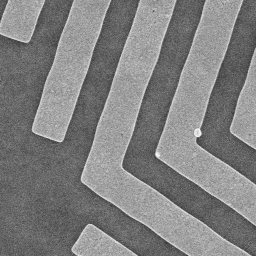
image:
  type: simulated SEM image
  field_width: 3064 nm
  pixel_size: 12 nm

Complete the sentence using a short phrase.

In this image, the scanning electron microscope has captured groups of lines, slits or small figures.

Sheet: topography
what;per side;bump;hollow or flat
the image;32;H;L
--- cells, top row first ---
LHHHHLLLLHHHHHLLLHHHHHLLLLHHHHLL
LHHHHLLLLHHHHLLLLHHHHHLLLHHHHHLL
HHHHHLLLHHHHHLLLLHHHHLLLLHHHHLLL
HHHHLLLLHHHHHLLLHHHHHLLLLHHHHLLL
LHHHLLLLHHHHLLLLHHHHLLLLHHHHHLLL
LLLLLLLHHHHHLLLLHHHHLLLLHHHHHLLL
LLLLLLLHHHHHLLLHHHHHLLLLHHHHLLLL
LLLLLLLHHHHLLLLHHHHHLLLHHHHHLLLH
LLLLLLHHHHHLLLLHHHHLLLLHHHHLLLLH
LLLLLLHHHHHLLLHHHHHLLLLHHHHLLLLH
LLLLLLHHHHLLLLHHHHLLLLHHHHHLLLLH
LLLLLHHHHHLLLLHHHHLLLLHHHHLLLLHH
LLLLLHHHHHLLLHHHHHLLLLHHHHLLLLHH
LLLLLHHHHLLLLHHHHLLLLHHHHHLLLLHH
LLLLHHHHHLLLLHHHHLLLLHHHHLLLLHHH
LLLLHHHHHLLLHHHHHLLLLHHHHLLLLHHH
LLLLHHHHLLLLHHHHHLLLHHHHHLLLLHHH
LLLLLLLHLLLLHHHHLLLLHHHHHLLLLLHH
LLLLLLLLLLLHHHHHLLLLHHHHHLLLLLLL
LLLLLLLLLLLHHHHHLLLLHHHHHHHLLLLL
LLLLLLLLLLLHHHHLLLLLLHHHHHHHLLLL
LLLLLLLLLLLHHHHHLLLLLLHHHHHHHLLL
LLLLLLLLLLHHHHHHHLLLLLLLHHHHHHHL
LLLLLLLLLLLHHHHHHHHLLLLLLHHHHHHH
LLLLLLLLLLLLLHHHHHHHLLLLLLLHHHHH
LLLLLLLLLLLLLLHHHHHHHHLLLLLLHHHH
LLLLLLLLLLLLLLLLHHHHHHHLLLLLLLHH
LLLLLLLLLLLLLLLLLHHHHHHHHLLLLLLH
LLLLLLLLLLLHLLLLLLLHHHHHHHLLLLLL
LLLLLLLLLLHHHLLLLLLLHHHHHHHLLLLL
LLLLLLLLLHHHHHHLLLLLLHHHHHHHHLLL
LLLLLLLLLHHHHHHHLLLLLLLHHHHHHHHL